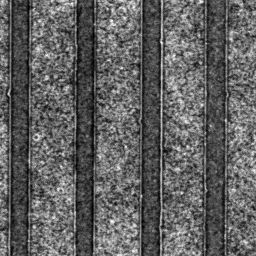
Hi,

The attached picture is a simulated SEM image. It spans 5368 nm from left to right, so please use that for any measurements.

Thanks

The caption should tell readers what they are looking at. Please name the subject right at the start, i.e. one or a few lines or trenches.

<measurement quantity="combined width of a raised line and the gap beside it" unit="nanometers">1370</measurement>